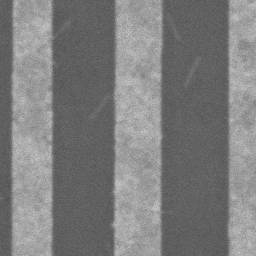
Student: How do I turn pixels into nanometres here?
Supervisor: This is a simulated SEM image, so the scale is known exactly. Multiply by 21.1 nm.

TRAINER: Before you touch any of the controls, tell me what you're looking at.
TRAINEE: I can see lines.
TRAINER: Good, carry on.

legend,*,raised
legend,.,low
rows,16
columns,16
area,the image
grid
.**....***....**
.**....***....**
.**....***....**
.**....***....**
.**....***....**
.**....***....**
.**....***....**
.**....***....**
.**....***....**
.**....***....**
.**....***....**
.**....***....**
.**....***....**
.**....***....**
.**....***....**
.**....***....**